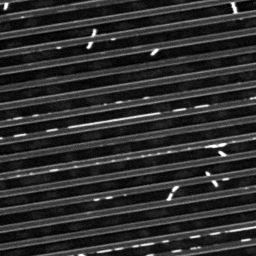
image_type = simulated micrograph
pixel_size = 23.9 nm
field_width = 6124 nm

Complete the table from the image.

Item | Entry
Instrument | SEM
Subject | parallel lines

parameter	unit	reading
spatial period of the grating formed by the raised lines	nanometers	415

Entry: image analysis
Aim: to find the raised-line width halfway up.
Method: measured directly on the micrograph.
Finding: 142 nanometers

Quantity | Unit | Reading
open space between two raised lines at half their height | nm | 286